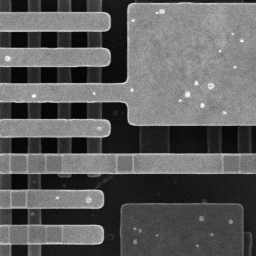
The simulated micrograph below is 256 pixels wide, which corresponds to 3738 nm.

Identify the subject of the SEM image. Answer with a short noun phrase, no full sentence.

wiring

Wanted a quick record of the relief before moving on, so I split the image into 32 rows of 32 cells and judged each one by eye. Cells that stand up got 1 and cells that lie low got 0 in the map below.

00000000000000001111111111111111
00000000000000001111111111111111
11111111111111001111111111111111
11111111111111001111111111111111
00000000000000001111111111111111
00000000000000001111111111111111
11111111111111001111111111111111
11111111111111001111111111111111
00000000000000001111111111111111
00000000000000001111111111111111
11111111111111111111111111111111
11111111111111111111111111111111
11111111111111111111111111111111
00000000000000001111111111111111
00000000000000001111111111111111
11111111111111001111111111111111
11111111111111000000000000000000
00000000000000000000000000000000
00000000000000000000000000000000
11111111111111111111111111111111
11111111111111111111111111111111
11111111111111111111111111111111
00000000000000000000000000000000
00000000000000000000000000000000
11111111111110000000000000000000
11111111111110000001000011000000
00000000000000011111111111111100
00000000000000011111111111111100
11111111111110011111111111111100
11111111111110011111111111111100
10000000001100011111111111111100
00000000000000011111111111111100